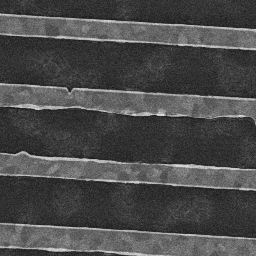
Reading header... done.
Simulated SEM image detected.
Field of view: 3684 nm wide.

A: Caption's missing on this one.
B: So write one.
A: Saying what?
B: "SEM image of one or a few lines or trenches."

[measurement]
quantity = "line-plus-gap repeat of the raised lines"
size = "70.1 px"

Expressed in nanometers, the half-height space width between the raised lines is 706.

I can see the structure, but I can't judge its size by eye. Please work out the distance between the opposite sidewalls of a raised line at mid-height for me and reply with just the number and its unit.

0.291 micrometres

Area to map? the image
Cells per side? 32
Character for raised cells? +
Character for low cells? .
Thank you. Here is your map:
................................
................................
+++++++++++.....................
++++++++++++++++++++++++++++....
....++++++++++++++++++++++++++++
......................++++++++++
................................
................................
................................
................................
................................
++++++++++++++++................
++++++++++++++++++++++++++++++++
...........+++++++++++++++++++++
........................++++++++
................................
................................
................................
................................
++++............................
+++++++++++++++++...............
++++++++++++++++++++++++++++++++
.............+++++++++++++++++++
...........................+++++
................................
................................
................................
................................
+++++++++.......................
++++++++++++++++++++++++++......
++++++++++++++++++++++++++++++++
..............++++++++++++++++++